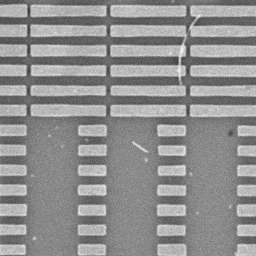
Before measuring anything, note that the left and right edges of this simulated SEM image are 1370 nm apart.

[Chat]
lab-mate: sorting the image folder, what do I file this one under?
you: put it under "wiring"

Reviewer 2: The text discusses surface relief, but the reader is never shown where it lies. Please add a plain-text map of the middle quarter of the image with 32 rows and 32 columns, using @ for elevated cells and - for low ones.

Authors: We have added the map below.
------------@@@@@@----------@@--
@@@@@@@@@@--@@@@@@@@@@@@@@@@@@--
@@@@@@@@@@--@@@@@@@@@@@@@@@@@@--
--------------------------------
--------------------------------
-------------@------------------
@@@@@@@@@@--@@@@@@@@@@@@@@@@@@--
@@@@@@@@@@--@@@@@@@@@@@@@@@@@@--
--------------------------------
--------------------------------
@@@---------@@@@@@@@@@@@@@@@@@--
@@@@@@@@@@--@@@@@@@@@@@@@@@@@@--
@@@@@@@@@@--@@@@@@@@@@@@@@@@@@--
--------------------------------
--------------------------------
----@@@@@@--------------@@@@@@--
----@@@@@@--------------@@@@@@--
----@@@@@@--------------@@@@@@--
--------------------------------
--------------------------------
------@@@@----------------------
----@@@@@@--------------@@@@@@--
----@@@@@@--------------@@@@@@--
--------------------------------
--------------------------------
----@@@@@@----------------------
----@@@@@@--------------@@@@@@--
----@@@@@@--------------@@@@@@--
--------------------------------
--------------------------------
----@@@@@@--------------@@@@@@--
----@@@@@@--------------@@@@@@--